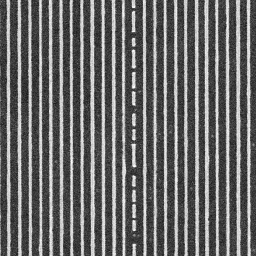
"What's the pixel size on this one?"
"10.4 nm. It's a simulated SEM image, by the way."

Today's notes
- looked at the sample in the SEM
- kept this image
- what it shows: parallel lines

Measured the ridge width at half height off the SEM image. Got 2.62 px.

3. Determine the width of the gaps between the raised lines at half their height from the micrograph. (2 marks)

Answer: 0.083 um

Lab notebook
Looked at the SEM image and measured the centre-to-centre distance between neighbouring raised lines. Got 108 nanometers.